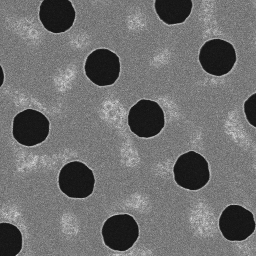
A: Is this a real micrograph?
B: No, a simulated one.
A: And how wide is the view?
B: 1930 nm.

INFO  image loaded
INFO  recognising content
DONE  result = holes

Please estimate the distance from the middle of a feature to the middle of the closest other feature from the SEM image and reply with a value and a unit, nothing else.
514 nm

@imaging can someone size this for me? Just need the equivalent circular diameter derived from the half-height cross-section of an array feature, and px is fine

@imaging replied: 36.8